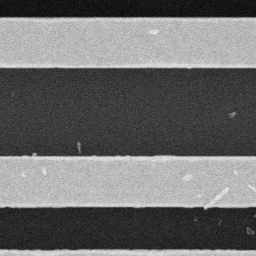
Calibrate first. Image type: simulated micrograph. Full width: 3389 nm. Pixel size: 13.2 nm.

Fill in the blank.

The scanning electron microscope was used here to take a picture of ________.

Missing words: lines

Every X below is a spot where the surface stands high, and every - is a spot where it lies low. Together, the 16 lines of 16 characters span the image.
----------------
XXXXXXXXXXXXXXXX
XXXXXXXXXXXXXXXX
XXXXXXXXXXXXXXXX
----------------
----------------
----------------
----------------
----------------
----------------
XXXXXXXXXXXXXXXX
XXXXXXXXXXXXXXXX
XXXXXXXXXXXXXXXX
----------------
----------------
----------------